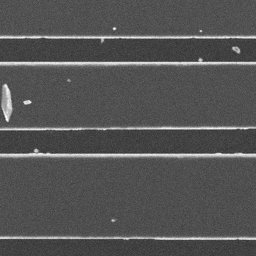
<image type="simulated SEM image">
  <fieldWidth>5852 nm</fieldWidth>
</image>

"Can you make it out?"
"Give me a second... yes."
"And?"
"lines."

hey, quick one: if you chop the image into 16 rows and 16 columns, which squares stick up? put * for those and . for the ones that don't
****************
****************
................
................
****************
****************
****************
****************
................
................
****************
****************
****************
****************
****************
................